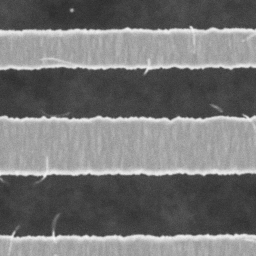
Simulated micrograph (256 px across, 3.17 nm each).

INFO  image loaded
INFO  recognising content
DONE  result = lines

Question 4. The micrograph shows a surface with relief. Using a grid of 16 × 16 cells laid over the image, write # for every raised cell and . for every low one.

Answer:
................
................
################
################
................
................
................
################
################
################
################
................
................
................
................
################